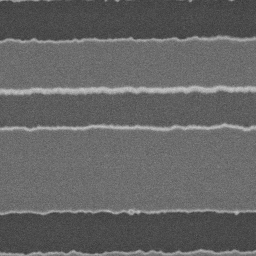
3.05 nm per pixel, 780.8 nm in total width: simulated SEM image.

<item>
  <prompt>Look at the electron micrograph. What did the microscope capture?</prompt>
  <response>lines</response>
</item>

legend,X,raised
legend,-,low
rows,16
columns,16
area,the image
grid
----------------
----------------
X----XXXXXXXXXXX
XXXXXXXXXXXXXXXX
XXXXXXXXXXXXXXXX
XXXXXXXXXXXXXXXX
----------------
----------------
XXXXXXXXXXXXXXXX
XXXXXXXXXXXXXXXX
XXXXXXXXXXXXXXXX
XXXXXXXXXXXXXXXX
XXXXXXXXXXXXXXXX
----------------
----------------
----------------